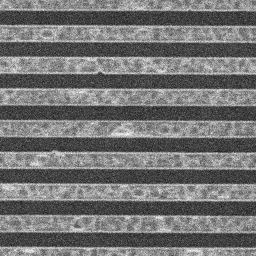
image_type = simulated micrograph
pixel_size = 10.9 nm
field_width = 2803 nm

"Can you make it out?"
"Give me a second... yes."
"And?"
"parallel lines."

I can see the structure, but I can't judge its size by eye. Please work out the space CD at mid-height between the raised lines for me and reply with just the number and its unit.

170 nm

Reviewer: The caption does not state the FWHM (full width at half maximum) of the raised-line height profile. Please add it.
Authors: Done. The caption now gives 179 nanometers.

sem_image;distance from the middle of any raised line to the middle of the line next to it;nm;347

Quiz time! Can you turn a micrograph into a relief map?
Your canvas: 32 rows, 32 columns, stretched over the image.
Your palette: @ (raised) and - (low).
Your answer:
@@@@@@@@@@@@@@@@@@@@@@@@@@@@@@@@
--------------------------------
--------------------------------
@@@@@@@@@@@@@@@@@@@@@@@@@@@@@@@@
@@@@@@@@@@@@@@@@@@@@@@@@@@@@@@@@
--------------------------------
--------------------------------
@@@@@@@@@@@@@@@@@@@@@@@@@@@@@@@@
@@@@@@@@@@@@@@@@@@@@@@@@@@@@@@@@
--------------------------------
--------------------------------
@@@@@@@@@@@@@@@@@@@@@@@@@@@@@@@@
@@@@@@@@@@@@@@@@@@@@@@@@@@@@@@@@
--------------------------------
--------------------------------
@@@@@@@@@@@@@@@@@@@@@@@@@@@@@@@@
@@@@@@@@@@@@@@@@@@@@@@@@@@@@@@@@
--------------------------------
--------------------------------
@@@@@@@@@@@@@@@@@@@@@@@@@@@@@@@@
@@@@@@@@@@@@@@@@@@@@@@@@@@@@@@@@
--------------------------------
--------------------------------
@@@@@@@@@@@@@@@@@@@@@@@@@@@@@@@@
@@@@@@@@@@@@@@@@@@@@@@@@@@@@@@@@
--------------------------------
--------------------------------
@@@@@@@@@@@@@@@@@@@@@@@@@@@@@@@@
@@@@@@@@@@@@@@@@@@@@@@@@@@@@@@@@
--------------------------------
--------------------------------
@@@@@@@@@@@@@@@@@@@@@@@@@@@@@@@@